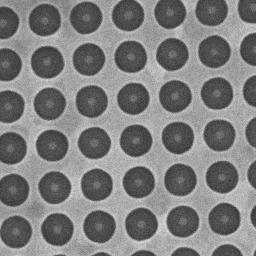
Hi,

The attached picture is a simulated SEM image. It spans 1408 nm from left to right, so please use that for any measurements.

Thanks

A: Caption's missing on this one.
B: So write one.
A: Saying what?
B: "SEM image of an array of small figures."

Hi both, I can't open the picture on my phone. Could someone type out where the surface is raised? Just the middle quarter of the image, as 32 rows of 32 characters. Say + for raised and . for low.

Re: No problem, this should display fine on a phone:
++........+++.......++++......++
+++......+++++......+++++...++++
++++....++++++++++++++++++++++++
++++++++++++++++++++++++++++++++
++++++++++++++++++++++++++....++
++++++...++++++.....++++.......+
++++......++++.......+++........
+++........++........+++........
+++........++.........++........
.++........++........+++........
+++........+++.......+++.......+
+++.......++++......+++++.....++
++++......++++++...+++++++++++++
++++++..++++++++++++++++++++++++
+++++++++++++++++++++++++++...++
++++++++++++++++....+++++.......
+++++.....+++++......++++.......
++++.......+++........++........
.+++........++........++........
.++.........++........+++.......
.++.........++........+++.......
.+++.......++++......+++++.....+
.++++......+++++....++++++++.+++
++++++...+++++++++++++++++++++++
++++++++++++++++++++++++++++++++
++++++++++++++++++..+++++++.....
++++++....++++++.....+++++......
+++++......++++.......+++.......
.+++........+++........++.......
..++........+++........++.......
..++........+++........++.......
..++........+++.......++++......